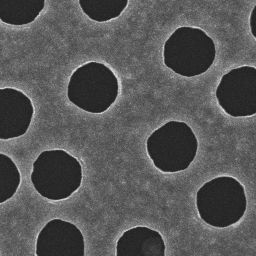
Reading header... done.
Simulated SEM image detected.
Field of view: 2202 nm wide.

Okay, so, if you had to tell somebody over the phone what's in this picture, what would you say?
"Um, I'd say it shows holes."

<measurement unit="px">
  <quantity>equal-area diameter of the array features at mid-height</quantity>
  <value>50.4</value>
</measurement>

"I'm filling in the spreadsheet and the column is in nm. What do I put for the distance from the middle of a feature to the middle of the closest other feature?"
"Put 812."